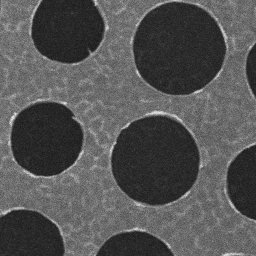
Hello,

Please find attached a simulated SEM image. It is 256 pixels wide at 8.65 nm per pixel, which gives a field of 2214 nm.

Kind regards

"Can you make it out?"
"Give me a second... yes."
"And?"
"holes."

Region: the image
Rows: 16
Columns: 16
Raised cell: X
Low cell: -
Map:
XX----XXXX---XXX
XX----XXX-----XX
XX----XX------XX
XXX--XXX------XX
XXXXXXXXX-----X-
XXXXXXXXXX---XXX
XX--XXXXXXXXXXXX
X----XXXX--XXXXX
X----XX-----XXXX
X----XX-----XXX-
X---XXX-----XX--
XXXXXXX-----XX--
XXXXXXXX---XXX--
---XXXXXXXXXXXX-
----XXXX-XXXXXXX
----XX-----XXXXX